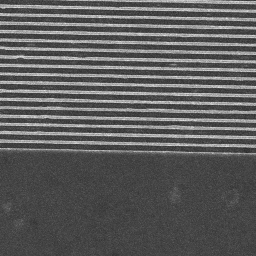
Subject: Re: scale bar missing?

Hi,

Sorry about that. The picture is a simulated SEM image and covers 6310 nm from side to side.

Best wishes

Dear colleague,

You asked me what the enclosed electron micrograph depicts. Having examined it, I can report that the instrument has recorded parallel lines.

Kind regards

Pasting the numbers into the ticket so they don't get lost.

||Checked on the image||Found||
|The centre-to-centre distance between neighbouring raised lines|8.43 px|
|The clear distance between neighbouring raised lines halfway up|157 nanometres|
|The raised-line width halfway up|67.8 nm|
